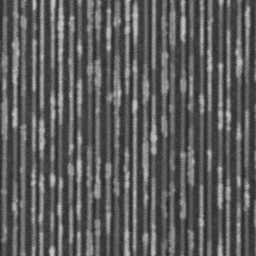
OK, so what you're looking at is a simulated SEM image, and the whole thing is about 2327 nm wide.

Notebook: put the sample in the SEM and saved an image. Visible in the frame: parallel lines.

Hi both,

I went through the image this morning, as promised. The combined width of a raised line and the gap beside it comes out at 9.33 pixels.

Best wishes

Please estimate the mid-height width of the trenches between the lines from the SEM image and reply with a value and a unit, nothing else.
54.5 nanometres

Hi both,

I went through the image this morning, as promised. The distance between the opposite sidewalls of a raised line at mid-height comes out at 30.7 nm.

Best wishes